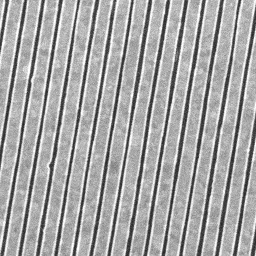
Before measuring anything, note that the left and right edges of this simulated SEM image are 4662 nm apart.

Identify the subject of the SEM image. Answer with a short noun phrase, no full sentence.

parallel lines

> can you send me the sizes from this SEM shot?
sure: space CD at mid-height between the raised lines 89.9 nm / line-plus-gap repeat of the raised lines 321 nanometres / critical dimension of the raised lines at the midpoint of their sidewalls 231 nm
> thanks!